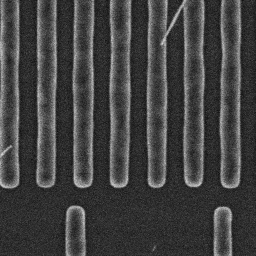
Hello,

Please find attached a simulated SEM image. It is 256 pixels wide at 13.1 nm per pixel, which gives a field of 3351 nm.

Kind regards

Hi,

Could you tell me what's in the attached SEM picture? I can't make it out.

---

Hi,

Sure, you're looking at wiring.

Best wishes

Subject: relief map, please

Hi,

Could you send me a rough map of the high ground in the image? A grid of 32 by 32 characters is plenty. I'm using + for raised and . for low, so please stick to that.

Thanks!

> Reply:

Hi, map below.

++...++..+++..++...++..++...++..
++...++..+++..++...++..++...++..
++...++..+++..++...++..++...++..
++...++..+++..++...++..++...++..
++...++..+++..++...++..++...++..
++...++..++...++...++..++...++..
++...++..++...++...++..++...++..
++...++..++...++...++..++...++..
++...++..+++..++...++..++...++..
++...++..+++..++..+++..++...++..
++...++..+++..++..+++..++...++..
++...++..+++..++..+++..++...++..
++...++..+++..++..+++..++...++..
++...++..+++..++..+++..++...++..
++...++..++...++..+++..++...++..
++...++..++...++..+++..++...++..
++...++..++...++..+++..++...++..
++...++..++...++..+++..++...++..
++...++..++...++..+++..++...++..
++...++..++...++...++..++...++..
++...++..++...++...++..++...++..
++...++..++...++...++..++...++..
++...++..++...++...++..++...++..
................................
................................
................................
........+++................++...
........+++................++...
........+++................++...
........+++................++...
........+++................++...
........+++................++...